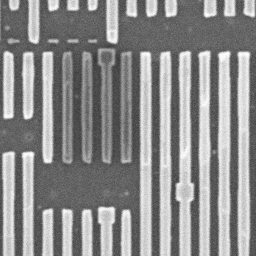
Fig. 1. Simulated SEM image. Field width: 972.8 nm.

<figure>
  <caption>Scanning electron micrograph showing wiring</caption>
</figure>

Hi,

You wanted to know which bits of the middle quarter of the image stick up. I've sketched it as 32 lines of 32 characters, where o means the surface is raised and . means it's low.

oo...oo..ooo..ooo..ooo..oo...oo.
oo...oo...oo..ooo..ooo..oo...oo.
oo...oo...oo..ooo..ooo..oo...oo.
oo...oo...oo..ooo..ooo..oo...oo.
oo...oo...oo..ooo..ooo..oo...oo.
oo...oo...oo..ooo..ooo..oo...oo.
oo...oo...oo..ooo..ooo..oo...oo.
oo...oo...oo..ooo..ooo..oo...oo.
oo...oo...oo..ooo..ooo..oo...oo.
oo...oo...oo..ooo..ooo..oo...oo.
oo...oo...oo..ooo..ooo..oo...oo.
oo...oo...oo..ooo..ooo..oo...oo.
oo...oo...oo..ooo..ooo..oo...oo.
oo...oo...oo..ooo..ooo..oo...oo.
oo...oo...oo..ooo..ooo..oo...oo.
oo...oo...oo..ooo..ooo..oo...oo.
oo...oo...oo..ooo..ooo..oo...oo.
oo...oo...oo..ooo..ooo..oo...oo.
oo...oo...oo..ooo..ooo..oo...oo.
oo...oo...oo..ooo..ooo..oo...oo.
oo...oo...oo..ooo..ooo..oo...oo.
oo...oo...oo..ooo..ooo..oo...oo.
oo...oo...oo..ooo..ooo..oo...oo.
oo...oo...o...ooo..ooo..oo...oo.
.o........o........ooo..oo...oo.
...................ooo..oo...oo.
...................ooo..oo...oo.
...................ooo..oo...oo.
...................ooo..oo...oo.
...................ooo..oo...oo.
...................ooo..oo..oooo
...................ooo..oo..oooo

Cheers